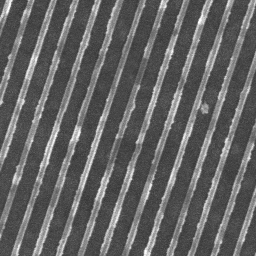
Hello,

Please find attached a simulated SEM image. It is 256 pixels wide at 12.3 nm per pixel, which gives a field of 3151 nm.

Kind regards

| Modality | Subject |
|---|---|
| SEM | parallel lines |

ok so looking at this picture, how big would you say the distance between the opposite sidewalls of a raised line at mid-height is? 67.2 nanometers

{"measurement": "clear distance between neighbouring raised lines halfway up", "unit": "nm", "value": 187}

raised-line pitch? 260 nanometres